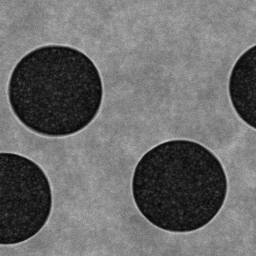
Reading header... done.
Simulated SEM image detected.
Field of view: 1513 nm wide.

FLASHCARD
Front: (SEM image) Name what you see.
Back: holes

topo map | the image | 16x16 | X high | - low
XXXXXXXXXXXXXXXX
XXXXXXXXXXXXXXXX
XXXXXXXXXXXXXXXX
XX---XXXXXXXXXX-
X-----XXXXXXXX--
X-----XXXXXXXX--
X-----XXXXXXXXX-
X-----XXXXXXXXX-
XXX-XXXXXXXXXXXX
XXXXXXXXX----XXX
--XXXXXXX-----XX
---XXXXX------XX
---XXXXX------XX
---XXXXXX----XXX
--XXXXXXXXXXXXXX
XXXXXXXXXXXXXXXX